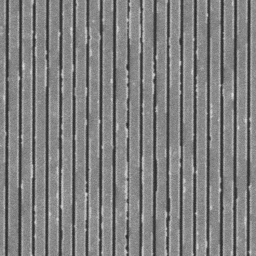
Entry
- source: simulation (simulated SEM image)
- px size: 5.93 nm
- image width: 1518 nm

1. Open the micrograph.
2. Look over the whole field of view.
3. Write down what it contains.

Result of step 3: parallel lines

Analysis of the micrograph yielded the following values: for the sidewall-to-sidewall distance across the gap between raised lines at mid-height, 21.5 nanometres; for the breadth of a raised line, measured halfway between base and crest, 0.0586 µm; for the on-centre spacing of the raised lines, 79.6 nm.